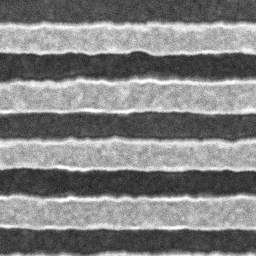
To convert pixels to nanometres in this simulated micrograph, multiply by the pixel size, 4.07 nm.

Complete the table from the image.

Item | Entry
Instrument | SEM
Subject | lines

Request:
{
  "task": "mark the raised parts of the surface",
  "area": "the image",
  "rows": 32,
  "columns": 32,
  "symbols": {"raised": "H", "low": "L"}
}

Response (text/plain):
LLLLLLLLLLLLLLLLLLLLLLLLLLLLLLLL
LLLLLLLLLLLLLLLLLLLLLLLLLLLLLLLL
LLLLLLLLLLLLLLLLLLLLLLLLLLLLLLLL
HHHHHHHHHHHHHHHHHHHHHHHHHHHHHHHH
HHHHHHHHHHHHHHHHHHHHHHHHHHHHHHHH
HHHHHHHHHHHHHHHHHHHHHHHHHHHHHHHH
HHHHHHHHHHHHHHHHLLHHHHHHHHHHHHHH
LLLLLLLLLLLLLLLLLLLLLLLLLLLLLLLL
LLLLLLLLLLLLLLLLLLLLLLLLLLLLLLLL
LLLLLLLLLLLLLLLLLLLLLLLLLLLLLLLL
LHHHHHHHHHHHHHHHHHHHHHHHHHHHHHHH
HHHHHHHHHHHHHHHHHHHHHHHHHHHHHHHH
HHHHHHHHHHHHHHHHHHHHHHHHHHHHHHHH
HHHHHHHHHHHHHHHHHHHHHHHHHHHHHHHH
LLLLLLLLLLLLLLLLLLLLLLLLLLLLLLLL
LLLLLLLLLLLLLLLLLLLLLLLLLLLLLLLL
LLLLLLLLLLLLLLLLLLLLLLLLLLLLLLLL
LLLLLLLLHLLLLHHHLLLLLLLLLLLLLLLH
HHHHHHHHHHHHHHHHHHHHHHHHHHHHHHHH
HHHHHHHHHHHHHHHHHHHHHHHHHHHHHHHH
HHHHHHHHHHHHHHHHHHHHHHHHHHHHHHHH
LLLLLLLLLLLLLLLLLLLLLLLLLLLLLLLL
LLLLLLLLLLLLLLLLLLLLLLLLLLLLLLLL
LLLLLLLLLLLLLLLLLLLLLLLLLLLLLLLL
LLHLLLLLLLLLLLLLLLLLLLLLLLLLLLHL
HHHHHHHHHHHHHHHHHHHHHHHHHHHHHHHH
HHHHHHHHHHHHHHHHHHHHHHHHHHHHHHHH
HHHHHHHHHHHHHHHHHHHHHHHHHHHHHHHH
LLLLHHHHHHHHHHHHHHHHHHHHHHHHHHHH
LLLLLLLLLLLLLLLLLLLLLLLLLLLLLLLL
LLLLLLLLLLLLLLLLLLLLLLLLLLLLLLLL
LLLLLLLLLLLLLLLLLLLLLLLLLLLLLLLL